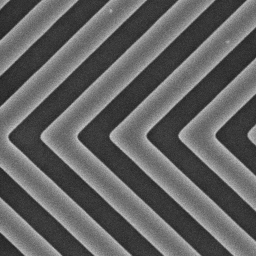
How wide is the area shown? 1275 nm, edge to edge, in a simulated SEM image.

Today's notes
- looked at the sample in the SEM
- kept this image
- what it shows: groups of lines, slits or small figures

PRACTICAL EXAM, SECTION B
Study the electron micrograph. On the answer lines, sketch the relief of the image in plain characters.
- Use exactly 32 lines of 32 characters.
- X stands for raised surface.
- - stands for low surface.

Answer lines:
X----XXXX----XXXXX----XXXX----XX
----XXXX----XXXXX----XXXX----XXX
---XXXX----XXXXX----XXXX----XXXX
--XXXX----XXXXX----XXXX----XXXXX
-XXXX----XXXXX----XXXX----XXXXX-
XXXX----XXXXX----XXXX----XXXXX--
XXX----XXXXX----XXXX----XXXXX---
XX----XXXXX----XXXX----XXXXX----
X----XXXXX----XXXX----XXXXX----X
----XXXXX----XXXX----XXXXX----XX
---XXXXX----XXXX----XXXXX----XXX
--XXXX-----XXXX----XXXXX----XXXX
-XXXX-----XXXX----XXXXX----XXXX-
XXXX-----XXXX----XXXXX----XXXX--
XXX----XXXXX----XXXXX----XXXX---
XX----XXXXX----XXXXX---XXXXX----
X----XXXXX----XXXXX----XXXX----X
X----XXXXX----XXXXX----XXXX----X
XX----XXXXX----XXXXX----XXXX----
XXX----XXXXX----XXXXX----XXXX---
XXXX----XXXXX----XXXXX----XXXX--
-XXXX----XXXXX----XXXXX----XXXX-
--XXXX-----XXXX----XXXXX----XXXX
---XXXX-----XXXX----XXXXX----XXX
----XXXXX----XXXX----XXXXX----XX
X----XXXXX----XXXX----XXXXX----X
XX----XXXXX----XXXX----XXXXX----
XXX----XXXXX----XXXX----XXXXX---
XXXX----XXXXX----XXXX-----XXXX--
-XXXX----XXXXX----XXXXX----XXXX-
--XXXX----XXXXX----XXXXX----XXXX
---XXXX----XXXXX----XXXXX----XXX